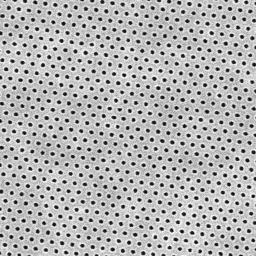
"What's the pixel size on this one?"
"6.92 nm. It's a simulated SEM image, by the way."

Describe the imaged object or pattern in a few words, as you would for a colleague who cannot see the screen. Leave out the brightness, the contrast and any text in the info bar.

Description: a regular array of holes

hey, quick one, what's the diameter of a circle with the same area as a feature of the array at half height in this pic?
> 28.2 nm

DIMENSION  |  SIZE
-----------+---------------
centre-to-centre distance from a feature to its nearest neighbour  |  67.8 nm